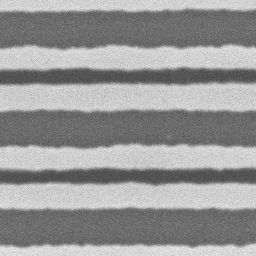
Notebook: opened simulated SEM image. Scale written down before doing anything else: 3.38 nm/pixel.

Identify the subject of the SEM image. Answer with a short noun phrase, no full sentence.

lines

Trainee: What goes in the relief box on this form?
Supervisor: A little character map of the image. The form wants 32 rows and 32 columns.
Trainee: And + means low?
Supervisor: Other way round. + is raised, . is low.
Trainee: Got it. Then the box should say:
++++++++++++++++++++++++++++++++
................................
................................
................................
................................
................................
++++++++++++++++++++++++++++++++
++++++++++++++++++++++++++++++++
+++++++++..+++++++++++....++++++
................................
............+++...........++++++
++++++++++++++++++++++++++++++++
++++++++++++++++++++++++++++++++
++++++++++++++++++++++++++++++++
................................
................................
................................
................................
+++++.........++++++++++++++.+..
++++++++++++++++++++++++++++++++
++++++++++++++++++++++++++++++++
................................
................................
++++++++++++++++++++++++++++++++
++++++++++++++++++++++++++++++++
++++++++++++++++++++++++++++++++
................................
................................
................................
................................
................................
++++++++++++++++++++++++++++++++